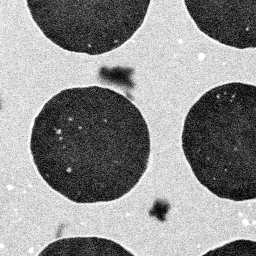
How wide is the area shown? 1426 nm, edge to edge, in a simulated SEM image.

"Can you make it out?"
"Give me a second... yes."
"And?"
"holes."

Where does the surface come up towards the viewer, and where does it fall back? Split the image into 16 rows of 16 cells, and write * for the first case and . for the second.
**.......***....
**.......***....
***.....*****...
****************
****************
*****..******...
***.....****....
**.......***....
**.......**.....
**.......**.....
**.......***....
***......****...
****...*******.*
****************
****************
***.....*****...